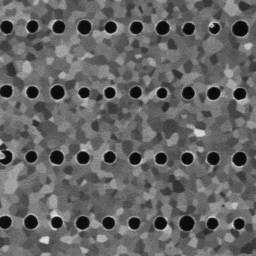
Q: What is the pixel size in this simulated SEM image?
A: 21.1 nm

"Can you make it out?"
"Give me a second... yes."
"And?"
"a regular array of holes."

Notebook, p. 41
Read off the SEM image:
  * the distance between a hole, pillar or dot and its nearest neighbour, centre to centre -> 540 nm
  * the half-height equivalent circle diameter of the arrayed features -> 277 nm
